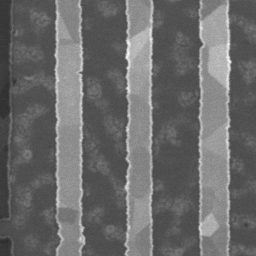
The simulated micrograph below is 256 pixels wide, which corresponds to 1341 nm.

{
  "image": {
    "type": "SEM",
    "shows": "one or a few lines or trenches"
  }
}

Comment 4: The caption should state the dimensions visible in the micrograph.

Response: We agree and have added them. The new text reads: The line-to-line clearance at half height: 247 nanometers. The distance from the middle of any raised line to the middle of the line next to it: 0.381 µm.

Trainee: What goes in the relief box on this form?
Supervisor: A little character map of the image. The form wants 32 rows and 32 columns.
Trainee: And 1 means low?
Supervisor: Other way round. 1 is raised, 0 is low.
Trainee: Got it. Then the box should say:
11000001110000001110000001111000
11000001110000001110000001110000
10000001110000001110000001111000
11000001110000001110000001111000
10000001110000001110000001111000
11000001110000001110000001111000
10000001110000001110000001111000
10000001110000001110000001111000
10000001110000001110000001111000
10000001110000001110000001111000
10000001110000001110000001111000
10000001110000001110000001110000
10000001110000001110000001111000
10000001110000001110000001110000
10000001110000001110000001111000
10000001110000001110000001111000
10000001110000001110000001110000
10000001110000001110000001110000
10000001110000001110000001111000
10010001110000001110000001111000
10000001110000001110000001111000
10000001110000001110000001111000
10000001110000001110000001111000
10000001110000001110000001110000
10000001110000001110000001111000
10000001110000001110000001111000
10000001110000001110000001111000
10000001110000001110000001110000
00000001110000001110000001111000
00000001110000001110000001111000
11000001110000001110000001111000
11000001110000001110001001111000